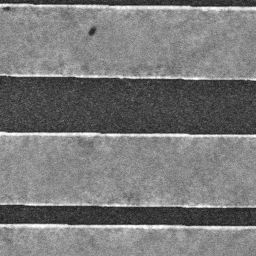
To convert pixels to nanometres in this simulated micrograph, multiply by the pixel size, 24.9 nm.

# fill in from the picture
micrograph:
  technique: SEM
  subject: lines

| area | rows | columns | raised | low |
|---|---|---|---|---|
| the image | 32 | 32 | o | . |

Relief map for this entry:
................................
oooooooooooooooooooooooooooooooo
oooooooooooooooooooooooooooooooo
oooooooooooooooooooooooooooooooo
oooooooooooooooooooooooooooooooo
oooooooooooooooooooooooooooooooo
oooooooooooooooooooooooooooooooo
oooooooooooooooooooooooooooooooo
oooooooooooooooooooooooooooooooo
..........oooooooooooooooooooooo
................................
................................
................................
................................
................................
................................
................................
oooooooooooooooooooooooooooooooo
oooooooooooooooooooooooooooooooo
oooooooooooooooooooooooooooooooo
oooooooooooooooooooooooooooooooo
oooooooooooooooooooooooooooooooo
oooooooooooooooooooooooooooooooo
oooooooooooooooooooooooooooooooo
oooooooooooooooooooooooooooooooo
...ooooooooooooooooooooooooooooo
................................
................................
oooooooooooooooooooooooooooooooo
oooooooooooooooooooooooooooooooo
oooooooooooooooooooooooooooooooo
oooooooooooooooooooooooooooooooo